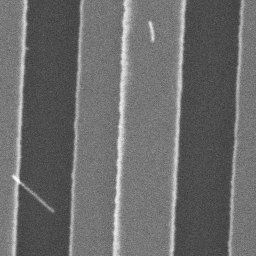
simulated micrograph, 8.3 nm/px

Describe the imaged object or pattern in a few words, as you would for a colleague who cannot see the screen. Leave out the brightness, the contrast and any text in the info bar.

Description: lines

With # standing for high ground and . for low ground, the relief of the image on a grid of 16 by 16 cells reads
##...#######...#
##...######....#
##...######....#
#....######....#
#....######....#
#....######....#
#....######....#
#....######....#
#....######....#
#....######....#
#....######....#
#....######....#
#....######....#
#....######...##
#...#######...##
#...#######...##